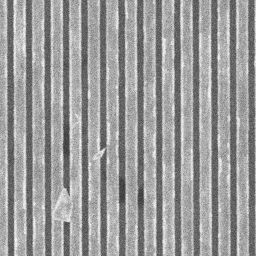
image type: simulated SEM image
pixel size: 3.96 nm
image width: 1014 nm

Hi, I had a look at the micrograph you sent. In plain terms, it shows parallel lines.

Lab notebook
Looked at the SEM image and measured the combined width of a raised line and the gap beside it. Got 73.4 nm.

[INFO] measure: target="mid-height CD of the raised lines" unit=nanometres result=44.6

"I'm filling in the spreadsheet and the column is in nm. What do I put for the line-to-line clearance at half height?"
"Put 30.7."